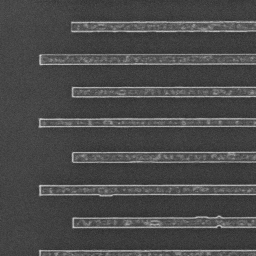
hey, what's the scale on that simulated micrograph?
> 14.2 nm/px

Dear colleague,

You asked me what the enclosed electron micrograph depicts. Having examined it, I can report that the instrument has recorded parallel lines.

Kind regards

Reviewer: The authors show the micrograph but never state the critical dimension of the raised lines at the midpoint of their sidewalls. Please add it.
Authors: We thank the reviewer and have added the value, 133 nm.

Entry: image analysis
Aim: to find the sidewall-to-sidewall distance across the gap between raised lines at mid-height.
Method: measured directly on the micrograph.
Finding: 326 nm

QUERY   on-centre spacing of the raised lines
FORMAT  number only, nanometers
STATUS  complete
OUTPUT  462